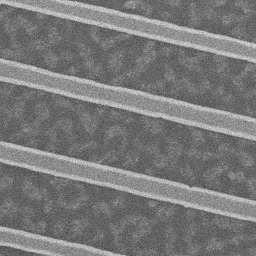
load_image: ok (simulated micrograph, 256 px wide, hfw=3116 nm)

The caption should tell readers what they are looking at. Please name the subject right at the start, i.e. one or a few lines or trenches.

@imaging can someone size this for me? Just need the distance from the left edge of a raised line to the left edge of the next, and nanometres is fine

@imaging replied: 949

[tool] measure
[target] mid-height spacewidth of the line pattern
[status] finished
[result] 766 nm